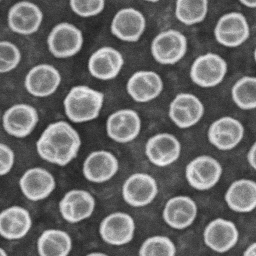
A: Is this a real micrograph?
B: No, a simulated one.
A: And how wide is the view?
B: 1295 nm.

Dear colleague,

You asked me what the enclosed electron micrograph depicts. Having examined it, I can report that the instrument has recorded a regular array of raised bodies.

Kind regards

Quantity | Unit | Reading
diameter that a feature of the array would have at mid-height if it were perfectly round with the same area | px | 30.9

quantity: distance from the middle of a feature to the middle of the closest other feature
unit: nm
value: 230